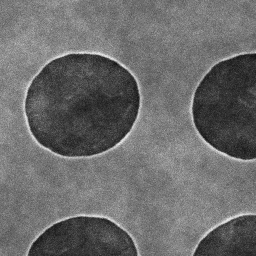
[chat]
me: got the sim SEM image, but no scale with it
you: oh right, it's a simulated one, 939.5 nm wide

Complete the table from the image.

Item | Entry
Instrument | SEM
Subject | holes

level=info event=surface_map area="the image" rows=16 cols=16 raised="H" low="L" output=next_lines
HHHHHHHHHHHHHHHH
HHHHHHHHHHHHHHHH
HHHHHHHHHHHHHHHH
HHHHLLLHHHHHHHHL
HHLLLLLLHHHHHLLL
HHLLLLLLLHHHLLLL
HHLLLLLLLHHHLLLL
HHLLLLLLHHHHLLLL
HHLLLLLLHHHHHLLL
HHHLLLHHHHHHHHLL
HHHHHHHHHHHHHHHH
HHHHHHHHHHHHHHHH
HHHHHHHHHHHHHHHH
HHHHHLHHHHHHHHHL
HHHLLLLLHHHHHLLL
HHLLLLLLHHHHLLLL